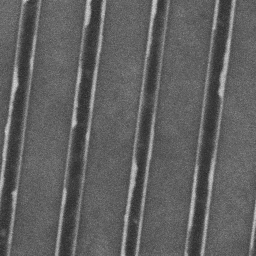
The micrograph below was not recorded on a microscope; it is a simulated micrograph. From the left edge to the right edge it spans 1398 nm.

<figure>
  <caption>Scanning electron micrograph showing one or a few lines or trenches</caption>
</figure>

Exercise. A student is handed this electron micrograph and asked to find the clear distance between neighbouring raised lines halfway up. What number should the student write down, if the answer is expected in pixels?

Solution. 45.8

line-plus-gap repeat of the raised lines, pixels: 64.2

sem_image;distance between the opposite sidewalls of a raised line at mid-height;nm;99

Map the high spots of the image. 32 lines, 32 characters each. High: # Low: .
...##......##......##......##...
...##......##......##......##...
...##......##......##......##...
..###.....###......##......##...
..###.....###......##......##...
..##......###.....###.....###...
..##......###.....##......###...
..##......##......##......###...
..##......##......##......##....
..##......##......##......##....
..##......##......##......##....
.###.....###......##......##....
.###.....###......##......##....
.##......###.....###.....###....
.##......##......##......###....
.##......##......##......##.....
.##......##......##......##.....
.##......##......##......##.....
###......##......##......##.....
###.....###......##......##.....
###.....###......##......##.....
##......###.....###.....###.....
##......##......##......###.....
##......##......##......##......
##......##......##......##......
##......##......##......##......
##......##......##......##......
##.....###......##......##......
##.....###.....###......##......
#......###.....###.....###.....#
#......##......##......###.....#
#......##......##......##......#